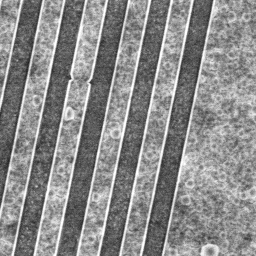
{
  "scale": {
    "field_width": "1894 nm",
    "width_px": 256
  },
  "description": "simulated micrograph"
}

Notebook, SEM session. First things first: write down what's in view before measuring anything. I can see parallel lines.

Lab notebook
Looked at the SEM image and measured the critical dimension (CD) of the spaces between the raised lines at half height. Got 20.7 px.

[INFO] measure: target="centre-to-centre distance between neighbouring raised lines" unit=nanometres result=310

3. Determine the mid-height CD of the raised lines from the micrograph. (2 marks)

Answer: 154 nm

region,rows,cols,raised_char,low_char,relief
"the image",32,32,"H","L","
HHHLLHHHLLLHHLLLHHHLLHHHLLLHHHHH
HHLLLHHHLLHHHLLLHHLLLHHHLLLHHHHH
HHLLLHHHLLHHHLLLHHLLLHHHLLHHHHHH
HHLLLHHLLLHHHLLHHHLLLHHLLLHHHHHH
HHLLHHHLLLHHLLLHHHLLLHHLLLHHHHHH
HHLLHHHLLLHHLLLHHHLLHHHLLLHHHHHH
HLLLHHHLLHHHLLLHHLLLHHHLLHHHHHHH
HLLLHHHLLHHHLLLHHLLLHHHLLHHHHHHH
HLLLHHLLLHHHLLHHHLLLHHLLLHHHHHHH
HLLHHHLLLHHHLLHHHLLHHHLLLHHHHHHH
HLLHHHLLLHHLLLHHHLLHHHLLLHHHHHHH
LLLHHHLLHHHLLLHHLLLHHHLLHHHHHHHH
LLLHHHLLHHHLLLHHLLLHHHLLHHHHHHHH
LLLHHLLLHHHLLHHHLLLHHLLLHHHHHHHH
LLHHHLLLHHLLLHHHLLHHHLLLHHHHHHHH
LLHHHLLLHHLLLHHHLLHHHLLLHHHHHHHH
LLHHHLLHHHLLLHHLLLHHHLLHHHHHHHHH
LLHHHLLHHHLLLHHLLLHHHLLHHHHHHHHH
LLHHLLLHHHLLHHHLLLHHLLLHHHHHHHHH
LHHHLLLHHLLLHHHLLHHHLLLHHHHHHHHH
LHHHLLLHHLLLHHHLLHHHLLLHHHHHHHHH
LHHHLLHHHLLLHHLLLHHHLLHHHHHHHHHH
LHHHLLHHHLLLHHLLLHHHLLHHHHHHHHHH
LHHLLLHHHLLHHHLLLHHLLLHHHHHHHHHH
HHHLLLHHHLLHHHLLHHHLLLHHHHHHHHHH
HHHLLLHHLLLHHHLLHHHLLLHHHHHHHHHH
HHHLLHHHLLLHHLLLHHHLLHHHHHHHHHHH
HHLLLHHHLLLHHLLLHHHLLHHHHHHHHHHH
HHLLLHHHLLHHHLLLHHLLLHHHHHHHHHHH
HHLLLHHLLLHHHLLHHHLLLHHHHHHHHHHH
HHLLLHHLLLHHHLLHHHLLLHHHHHHHHHHH
HHLLHHHLLLHHLLLHHHLLHHHHHHHHHHHH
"